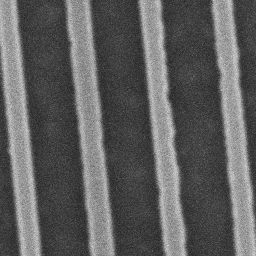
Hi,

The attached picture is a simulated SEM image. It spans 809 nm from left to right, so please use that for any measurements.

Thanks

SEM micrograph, one or a few lines or trenches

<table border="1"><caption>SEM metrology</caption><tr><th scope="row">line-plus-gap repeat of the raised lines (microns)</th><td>0.227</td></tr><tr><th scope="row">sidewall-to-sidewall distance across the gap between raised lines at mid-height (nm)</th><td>169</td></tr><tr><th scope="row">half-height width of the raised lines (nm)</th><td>57.1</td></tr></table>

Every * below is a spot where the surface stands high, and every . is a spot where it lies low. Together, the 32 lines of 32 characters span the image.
**......***.......**.......**...
**.......**.......**.......**...
**.......**.......**.......**...
**.......**.......**.......**...
**.......**.......**.......**...
**.......**.......**.......**...
**.......***......**.......***..
***......***......***......***..
***......***.......**.......**..
.**......***.......**.......**..
.**......***.......**.......**..
.**.......**.......**.......**..
.**.......**.......**.......**..
.**.......**.......**.......**..
.**.......**.......**.......**..
.**.......**.......**.......**..
.***......***......***......**..
.***......***......***......***.
.***......***......***.......**.
.***......***.......**.......**.
..**.......**.......**.......**.
..**.......**.......**.......**.
..**.......**.......**.......**.
..**.......**.......**.......**.
..**.......**.......**.......**.
..**.......***......**.......**.
..**.......***......**.......**.
..***......***......***......***
..***......***......***......***
...**......***.......**......***
...**......***.......**.......**
...**.......**.......**.......**